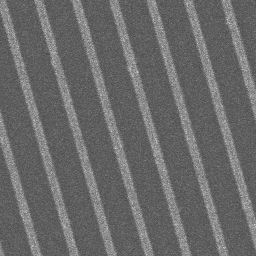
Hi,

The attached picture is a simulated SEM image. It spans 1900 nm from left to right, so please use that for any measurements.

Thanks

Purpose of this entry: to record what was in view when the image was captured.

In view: parallel lines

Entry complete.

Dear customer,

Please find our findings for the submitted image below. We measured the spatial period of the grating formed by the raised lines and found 35.9 px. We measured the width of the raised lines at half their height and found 58.8 nanometres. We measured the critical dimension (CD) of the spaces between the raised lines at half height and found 0.208 micrometres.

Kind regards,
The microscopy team